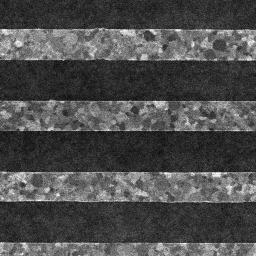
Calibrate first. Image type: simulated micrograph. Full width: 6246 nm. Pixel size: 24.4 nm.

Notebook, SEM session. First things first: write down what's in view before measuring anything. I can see one or a few lines or trenches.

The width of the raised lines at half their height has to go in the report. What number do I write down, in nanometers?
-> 714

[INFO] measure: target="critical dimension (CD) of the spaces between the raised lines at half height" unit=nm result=1010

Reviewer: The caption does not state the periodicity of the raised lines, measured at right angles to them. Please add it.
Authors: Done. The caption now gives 1740 nm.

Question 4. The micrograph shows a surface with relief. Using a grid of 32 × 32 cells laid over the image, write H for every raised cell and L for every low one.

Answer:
LLLLLLLLLLLLLLLLLLLLLLLLLLLLLLLL
LLLLLLLLLLLLLLLLLLLLLLLLLLLLLLLL
LLLLLLLLLLLLLLLLLLLLLLLLLLLLLLLL
LLLLLLLLLLLLLLLLLLLLLLLLLLLLLLLL
HHHHHHHHHHHHHHHHHHHHHHHHHHHHHHHH
HHHHHHHHHHHHHHHHHHHHHHHHHHHHHHHH
HHHHHHHHHHHHHHHHHHHHHHHHHHHHHHHH
LLLLLLLHLLLLLLLLLLLLLLLLLLHHLLLL
LLLLLLLLLLLLLLLLLLLLLLLLLLLLLLLL
LLLLLLLLLLLLLLLLLLLLLLLLLLLLLLLL
LLLLLLLLLLLLLLLLLLLLLLLLLLLLLLLL
LLLLLLLLLLLLLLLLLLLLLLLLLLLLLLLL
LLLLLLLLLLLLLLLLLLLLLLLLLLLLLLLL
HHHHHHHHHHHHHHHHHHHHHHHHHHHHHHHH
HHHHHHHHHHHHHHHHHHHHHHHHHHHHHHHH
HHHHHHHHHHHHHHHHHHHHHHHHHHHHHHHH
LLLLLLLLLLLLLLLLLLLLLLLLLLLLLLLL
LLLLLLLLLLLLLLLLLLLLLLLLLLLLLLLL
LLLLLLLLLLLLLLLLLLLLLLLLLLLLLLLL
LLLLLLLLLLLLLLLLLLLLLLLLLLLLLLLL
LLLLLLLLLLLLLLLLLLLLLLLLLLLLLLLL
LLLLLLLLLLLLLLLLLLLLLLLLLLLLLLLL
HHHHHHHHHHHHHHHHHHHHHHHHHHHHHHHH
HHHHHHHHHHHHHHHHHHHHHHHHHHHHHHHH
HHHHHHHHHHHHHHHHHHHHHHHHHHHHHHHH
LLLLLLLLLLLLLLLLLLLLLLLLLLLLLLLL
LLLLLLLLLLLLLLLLLLLLLLLLLLLLLLLL
LLLLLLLLLLLLLLLLLLLLLLLLLLLLLLLL
LLLLLLLLLLLLLLLLLLLLLLLLLLLLLLLL
LLLLLLLLLLLLLLLLLLLLLLLLLLLLLLLL
HHHHHHHHHHHHHHHHHHHHHHHHHHHHHHHH
HHHHHHHHHHHHHHHHHHHHHHHHHHHHHHHH